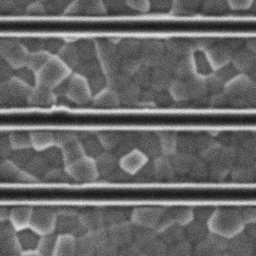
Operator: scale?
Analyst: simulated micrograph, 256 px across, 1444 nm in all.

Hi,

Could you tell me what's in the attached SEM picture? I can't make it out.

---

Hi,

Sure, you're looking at one or a few lines or trenches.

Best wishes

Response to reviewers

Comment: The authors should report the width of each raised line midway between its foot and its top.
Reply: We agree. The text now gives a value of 99.4 nm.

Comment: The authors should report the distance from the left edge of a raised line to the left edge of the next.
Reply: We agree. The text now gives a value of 83.8 pixels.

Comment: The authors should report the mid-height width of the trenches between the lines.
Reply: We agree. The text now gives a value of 365 nm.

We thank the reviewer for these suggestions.